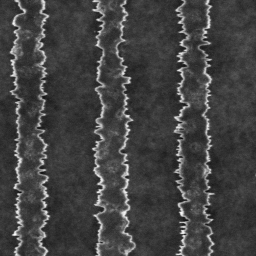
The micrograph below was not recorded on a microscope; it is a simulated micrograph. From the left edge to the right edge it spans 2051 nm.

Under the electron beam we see one or a few lines or trenches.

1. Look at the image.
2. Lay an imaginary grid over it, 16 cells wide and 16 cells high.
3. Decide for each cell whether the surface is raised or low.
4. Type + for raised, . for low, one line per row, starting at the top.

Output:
.++...++...++...
.++...++...++...
.++...++...++...
.++...+....++...
.++...++...++...
.++...++...++...
.++...++...++...
.++...++...++...
.++...++...++...
.++...++...++...
.++...++...++...
.++...++...++...
.++...++...++...
.++...++...++...
.++...++...++...
.++...++...++...